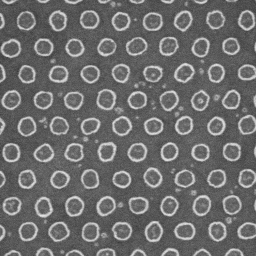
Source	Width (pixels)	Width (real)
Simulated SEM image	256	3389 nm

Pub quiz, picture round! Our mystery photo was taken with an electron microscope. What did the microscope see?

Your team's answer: a regular array of raised bodies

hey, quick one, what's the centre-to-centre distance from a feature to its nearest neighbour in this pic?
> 398 nm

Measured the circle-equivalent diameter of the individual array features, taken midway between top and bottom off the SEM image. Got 228 nm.